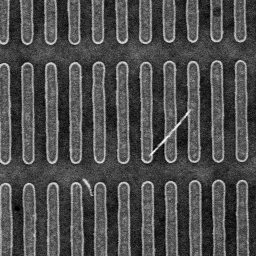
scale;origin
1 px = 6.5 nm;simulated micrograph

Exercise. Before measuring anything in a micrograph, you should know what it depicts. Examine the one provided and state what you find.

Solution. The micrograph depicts groups of lines, slits or small figures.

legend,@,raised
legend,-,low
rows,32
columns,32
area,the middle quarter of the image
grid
--@@---@@@----@@---@@@---@@@---@
--@@---@@@---@@@---@@@---@@@---@
--@@---@@@---@@@---@@@---@@@---@
--@@---@@@---@@@---@@@---@@@---@
--@@---@@@----@@---@@@---@@@---@
--@@---@@@----@@---@@@---@@@---@
--@@---@@@----@@---@@@---@@@---@
--@@---@@@----@@---@@@---@@@---@
--@@---@@@----@@---@@@---@@@---@
--@@---@@@----@@----@@---@@@---@
--@@---@@@----@@----@@---@@@---@
--@@---@@@----@@----@@---@@@---@
--@@----@@----@@---@@@---@@@---@
--@@----@@----@@---@@@---@@@---@
--@@----@@----@@---@@@---@@@---@
--@@----@@----@@---@@@---@@@---@
--@@----@@----@@----@@---@@@---@
--@@----@@----@@----@@---@@@---@
--@@----@@----@@----@@---@@@---@
--@@----@@----@@----@@---@@@---@
--@@----@@----@@----@@---@@@---@
--@@----@@----@@----@@---@@@---@
--@@----@@----@@----@@---@@@---@
--@@----@@----@@----@@---@@@---@
--@@----@-----@@----@-----------
--------------------------------
--------------------------------
--------------------------------
--------------------------------
--------------------@-----@-----
--@@----@@----@@----@@---@@@----
--@@----@@----@@----@@---@@@----